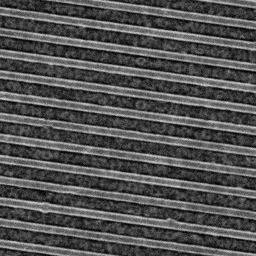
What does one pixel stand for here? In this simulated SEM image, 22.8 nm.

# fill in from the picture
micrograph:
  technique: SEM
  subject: parallel lines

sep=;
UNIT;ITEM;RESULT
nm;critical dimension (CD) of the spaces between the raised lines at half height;339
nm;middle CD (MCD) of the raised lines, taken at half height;147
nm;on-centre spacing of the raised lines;478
